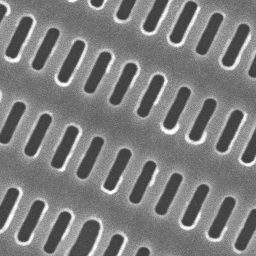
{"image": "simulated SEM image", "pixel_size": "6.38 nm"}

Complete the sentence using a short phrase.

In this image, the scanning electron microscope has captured a regular array of holes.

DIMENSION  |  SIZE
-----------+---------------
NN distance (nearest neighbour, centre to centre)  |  183 nm